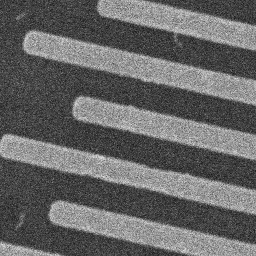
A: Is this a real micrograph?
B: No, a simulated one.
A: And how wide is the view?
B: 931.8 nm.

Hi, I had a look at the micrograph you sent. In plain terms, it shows parallel lines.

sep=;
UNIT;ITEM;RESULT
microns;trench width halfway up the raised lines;0.11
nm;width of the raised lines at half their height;84.2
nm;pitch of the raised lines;194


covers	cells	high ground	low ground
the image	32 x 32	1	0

00000000000011111111000000000000
00000000000001111111111100000000
00000000000000011111111111110000
00000000000000000000111111111111
00011110000000000000000011111111
00011111111000000000000000000111
00011111111111110000000000000000
00000001111111111111000000000000
00000000000011111111111110000000
00000000000000001111111111111000
00000000000000000000011111111111
00000000000000000000000001111111
00000000001100000000000000000111
00000000011111111000000000000000
00000000011111111111100000000000
00000000000011111111111110000000
00000000000000000111111111111100
11110000000000000000011111111111
11111111000000000000000000111111
11111111111100000000000000000011
00001111111111111000000000000000
00000000011111111111100000000000
00000000000001111111111111000000
00000000000000000011111111111100
00000000000000000000001111111111
00000001100000000000000000111111
00000011111111000000000000000001
00000011111111111100000000000000
00000000011111111111110000000000
00000000000000111111111111000000
10000000000000000011111111111110
11111000000000000000000111111111